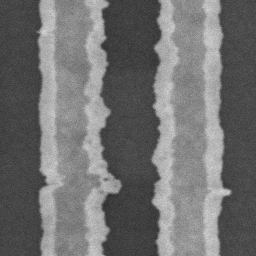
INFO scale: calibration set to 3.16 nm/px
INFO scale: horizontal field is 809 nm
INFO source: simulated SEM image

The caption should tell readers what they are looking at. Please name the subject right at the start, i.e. one or a few lines or trenches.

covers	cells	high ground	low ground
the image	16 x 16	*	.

...***....***...
...***....***...
...***....***...
...***.....**...
...***....***...
...***....***...
...***....***...
...***....***...
...***....***...
...***....***...
...***....***...
...****...***...
...***....***...
...***....***...
...***....***...
...***....***...